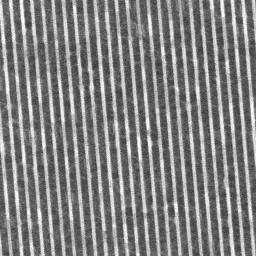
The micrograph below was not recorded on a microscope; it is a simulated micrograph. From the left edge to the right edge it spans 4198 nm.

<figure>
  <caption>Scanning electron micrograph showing parallel lines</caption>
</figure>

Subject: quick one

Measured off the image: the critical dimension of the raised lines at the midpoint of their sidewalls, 0.0449 um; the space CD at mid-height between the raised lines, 131 nanometers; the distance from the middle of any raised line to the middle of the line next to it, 173 nm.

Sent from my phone